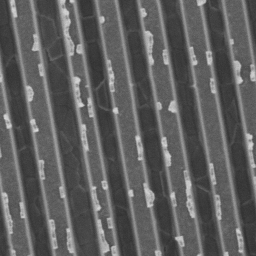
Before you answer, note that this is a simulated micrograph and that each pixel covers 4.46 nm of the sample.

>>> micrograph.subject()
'parallel lines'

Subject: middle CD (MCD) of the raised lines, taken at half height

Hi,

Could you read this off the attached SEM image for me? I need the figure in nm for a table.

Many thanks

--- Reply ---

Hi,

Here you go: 95.2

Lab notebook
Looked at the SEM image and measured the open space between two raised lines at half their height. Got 91.3 nanometres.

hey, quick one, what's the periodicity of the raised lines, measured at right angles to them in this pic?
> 0.187 um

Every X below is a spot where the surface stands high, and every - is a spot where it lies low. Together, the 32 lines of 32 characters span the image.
-XXX---XX---XXX--XXX---XX---XXX-
--XX----XX--XXX---XX---XX---XXX-
--XX----XX--XXX---XX---XXX--XXX-
--XXX---XX---XX---XX---XXX--XXX-
--XXX---XX---XX---XXX--XXX---XX-
--XXX---XX---XX---XXX--XXX---XX-
--XXX---XX---XXX--XXX---XX---XXX
---XX----XX--XXX---XX---XX---XXX
---XX----XX--XXX---XX---XXX--XXX
---XXX---XX---XX---XX---XXX--XXX
---XXX---XX---XX---XXX--XXX---XX
X--XXX---XX---XXX--XXX---XX---XX
X--XXX---XX---XXX--XXX---XX---XX
X---XX----XX--XXX---XX---XX---XX
X---XX----XX--XXX---XX---XXX--XX
X---XXX---XX---XX---XX---XXX--XX
X---XXX---XX---XX---XXX--XXX---X
XX--XXX---XX---XXX--XXX---XX---X
XX--XXX----XX--XXX--XXX---XX---X
XX---XX----XX--XXX---XX---XX---X
XX---XX----XX--XXX---XX---XXX--X
XX---XXX---XX---XX---XXX--XXX---
XX---XXX---XX---XX---XXX--XXX---
XXX--XXX---XX---XXX--XXX---XX---
XXX--XXX----XX--XXX--XXX---XX---
XXX---XX----XX--XXX---XX---XX---
-XX---XX----XX--XXX---XX---XXX--
-XX---XXX---XX---XX---XXX--XXX--
-XXX--XXX---XX---XX---XXX--XXX--
-XXX--XXX---XX---XXX--XXX---XX--
-XXX--XXX----XX--XXX--XXX---XX--
-XXX---XX----XX--XXX---XX---XXX-